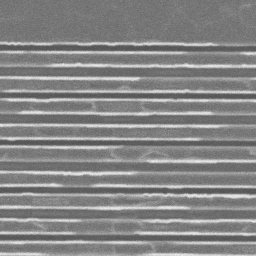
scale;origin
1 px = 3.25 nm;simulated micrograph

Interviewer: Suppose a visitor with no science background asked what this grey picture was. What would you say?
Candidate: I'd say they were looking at parallel lines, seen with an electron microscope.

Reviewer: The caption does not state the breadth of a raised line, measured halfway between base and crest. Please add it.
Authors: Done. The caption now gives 0.0511 um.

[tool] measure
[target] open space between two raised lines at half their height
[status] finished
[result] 22.3 nanometres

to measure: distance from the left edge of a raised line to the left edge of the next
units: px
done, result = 23.9